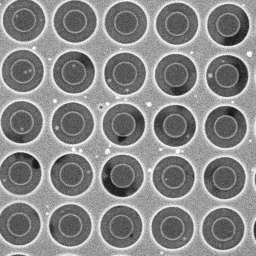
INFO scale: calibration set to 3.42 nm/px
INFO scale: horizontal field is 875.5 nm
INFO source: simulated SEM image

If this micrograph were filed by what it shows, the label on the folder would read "an array of small figures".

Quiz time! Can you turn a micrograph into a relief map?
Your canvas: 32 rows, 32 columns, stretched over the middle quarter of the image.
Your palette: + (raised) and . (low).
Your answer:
+++++...++...++++...+++...++++..
+++++...++..++++++...++..++++++.
+++++...++..++++++...++..++++++.
+++++...++...+++++..+++..++++++.
.+++...+++...++++...+++...++++..
.......++++.........+++....++...
......++++++.......+++++........
++.++++++++++....+++++++++....++
++++++++++++++++++++++++++++++++
+..+++++++++++++++++++++++++++++
.....++++.++......++++++++....++
......+++++........+++++.......+
++++...+++....++....+++.........
+++++..+++..+++++...+++...++++..
+++++...++..++++++..++...+++++..
+++++...++..++++++..++...+++++..
+++++..+++..+++++...++...+++++..
.++....+++...+++....+++...++++..
......+++++........++++.........
.....+++++++......++++++.......+
++++++++++++++..++++++++++....++
++++++++++++++++++++++++++++++++
...+++++++++++++++++++++++++++++
.....++++++.......+++++++.....++
......+++++........+++++.......+
++++...+++...+++...++++.........
++++...+++..+++++...++...+++++..
+++++..++...+++++...++...+++++..
+++++..++...+++++...++...+++++..
++++...++...+++++...++...+++++..
.......+++...+++...+++....+++...
......++++.........++++.........